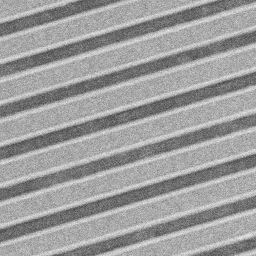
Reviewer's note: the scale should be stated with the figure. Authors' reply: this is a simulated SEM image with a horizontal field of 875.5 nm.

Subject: parallel lines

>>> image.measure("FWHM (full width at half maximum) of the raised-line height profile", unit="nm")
79.4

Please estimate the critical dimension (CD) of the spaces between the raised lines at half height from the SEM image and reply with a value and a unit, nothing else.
16.4 pixels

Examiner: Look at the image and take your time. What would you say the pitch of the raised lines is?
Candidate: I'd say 135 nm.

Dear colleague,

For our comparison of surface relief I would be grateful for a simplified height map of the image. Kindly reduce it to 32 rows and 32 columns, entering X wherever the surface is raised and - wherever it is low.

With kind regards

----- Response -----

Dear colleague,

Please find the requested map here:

XXXXXXXX-------XXXXXXXXXX-------
XXXX-------XXXXXXXXXX--------XXX
X-------XXXXXXXXXX-------XXXXXXX
----XXXXXXXXXXX-------XXXXXXXXXX
-XXXXXXXXXX--------XXXXXXXXX----
XXXXXXXX-------XXXXXXXXXX-------
XXXXX-------XXXXXXXXXX-------XXX
X-------XXXXXXXXXX--------XXXXXX
-----XXXXXXXXXX-------XXXXXXXXXX
--XXXXXXXXXX-------XXXXXXXXXX---
XXXXXXXX-------XXXXXXXXXXX------
XXXXX-------XXXXXXXXXXX-------XX
X--------XXXXXXXXXX-------XXXXXX
-----XXXXXXXXXXX-------XXXXXXXXX
--XXXXXXXXXXX------XXXXXXXXXXX--
XXXXXXXXX-------XXXXXXXXXX------
XXXXXX-------XXXXXXXXXX-------XX
XX-------XXXXXXXXXXX-------XXXXX
------XXXXXXXXXX-------XXXXXXXXX
---XXXXXXXXXX-------XXXXXXXXXX--
XXXXXXXXX--------XXXXXXXXXX-----
XXXXXX-------XXXXXXXXXXX-------X
XXX-------XXXXXXXXXX-------XXXXX
-------XXXXXXXXXX-------XXXXXXXX
---XXXXXXXXXX--------XXXXXXXXXX-
XXXXXXXXXX-------XXXXXXXXXX-----
XXXXXXX-------XXXXXXXXXX-------X
XXX--------XXXXXXXXX--------XXXX
-------XXXXXXXXXX-------XXXXXXXX
----XXXXXXXXXX-------XXXXXXXXXX-
XXXXXXXXXX-------XXXXXXXXXXX----
XXXXXXX-------XXXXXXXXXX--------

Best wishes